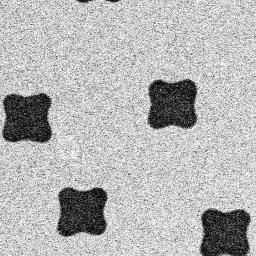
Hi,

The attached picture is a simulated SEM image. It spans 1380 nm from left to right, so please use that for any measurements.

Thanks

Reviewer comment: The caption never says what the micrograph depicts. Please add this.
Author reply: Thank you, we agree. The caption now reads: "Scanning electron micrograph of holes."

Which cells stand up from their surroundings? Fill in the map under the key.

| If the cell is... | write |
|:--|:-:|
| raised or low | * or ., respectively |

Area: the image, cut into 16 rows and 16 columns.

****************
****************
****************
****************
****************
*********...****
...******...****
...******...****
...*************
****************
****************
****************
****...*********
****...******..*
****..*******..*
*************...